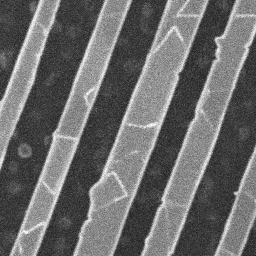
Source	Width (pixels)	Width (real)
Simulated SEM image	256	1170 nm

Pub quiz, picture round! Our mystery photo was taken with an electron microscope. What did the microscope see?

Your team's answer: one or a few lines or trenches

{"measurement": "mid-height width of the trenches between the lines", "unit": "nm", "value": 168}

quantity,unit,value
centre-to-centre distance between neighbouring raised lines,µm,0.288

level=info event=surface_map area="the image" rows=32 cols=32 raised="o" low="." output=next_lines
.....oo......ooo.....ooooo...ooo
.....oo......ooo.....oooo....ooo
....ooo.....ooo.....ooooo....ooo
....oo......ooo.....ooooo...oooo
....oo......ooo.....oooo....oooo
...oo......ooo.....ooooo...oooo.
...oo......ooo.....oooo....oooo.
..ooo......ooo....ooooo....ooo..
..ooo.....ooo.....ooooo...oooo..
..oo......ooo.....oooo....oooo..
.ooo.....ooo.....ooooo....ooo...
.ooo.....ooo.....ooooo...oooo...
ooo......ooo....ooooo....oooo...
ooo.....ooo.....ooooo....ooo....
oo......ooo.....ooooo....ooo....
oo.....ooo.....ooooo....oooo....
oo.....ooo.....ooooo....ooo.....
o......ooo.....oooo....oooo.....
o.....ooo.....ooooo....ooo......
......ooo.....ooooo...oooo......
......ooo.....oooo....oooo.....o
.....ooo.....ooooo....ooo......o
.....ooo.....oooo....oooo.....oo
.....oo.....ooooo....ooo......oo
....ooo....oooooo....ooo......oo
....ooo....ooooo....oooo.....ooo
...ooo.....ooooo....ooo......ooo
...ooo.....ooooo...oooo......ooo
...ooo....ooooo....oooo.....ooo.
..ooo.....ooooo....ooo......ooo.
..ooo.....ooooo...oooo......ooo.
..oo......oooo....ooo......ooo..